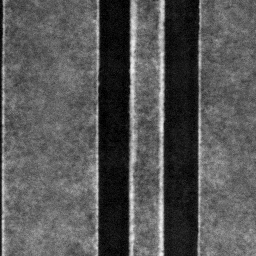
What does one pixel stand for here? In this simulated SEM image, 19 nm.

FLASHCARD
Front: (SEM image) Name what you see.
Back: lines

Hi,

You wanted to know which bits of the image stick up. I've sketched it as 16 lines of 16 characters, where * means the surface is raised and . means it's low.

******..**...***
******..**...***
******..**..****
******..**..****
******..**..****
******..**..****
******..**..****
******..**..****
******..**..****
******..**..****
******..**..****
******..**..****
******..**..****
******..**..****
******..**..****
******..**..****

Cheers